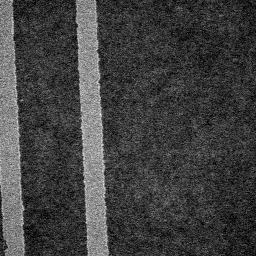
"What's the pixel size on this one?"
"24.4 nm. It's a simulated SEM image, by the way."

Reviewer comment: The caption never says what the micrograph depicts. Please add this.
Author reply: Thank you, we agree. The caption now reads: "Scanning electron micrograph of one or a few lines or trenches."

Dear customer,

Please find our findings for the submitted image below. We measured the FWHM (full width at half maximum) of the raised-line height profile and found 0.469 µm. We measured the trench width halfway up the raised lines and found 1570 nanometres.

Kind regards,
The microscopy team